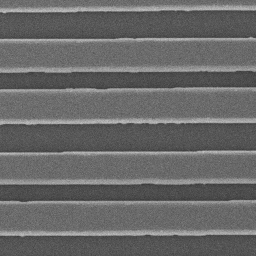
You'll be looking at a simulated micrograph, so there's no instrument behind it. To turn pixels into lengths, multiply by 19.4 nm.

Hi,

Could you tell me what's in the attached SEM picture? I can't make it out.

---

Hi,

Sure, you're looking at lines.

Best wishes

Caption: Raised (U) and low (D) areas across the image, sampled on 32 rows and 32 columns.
UUUUUUUUUUUUUUUUUUUUUUUUUUUUUUUU
DDDDDDDDDDDDDDDDDDDDDDDDDDDDDDDD
DDDDDDDDDDDDDDDDDDDDDDDDDDDDDDDD
DDDDDDDDDDDDDDDDDDDDDDDDDDDDDDDD
DDDDDDDDDDDDDDDDDDDDDDDDDDDDDDDD
UUUUUUUUUUUUUUUUUUUUUUUUUUUUUUUU
UUUUUUUUUUUUUUUUUUUUUUUUUUUUUUUU
UUUUUUUUUUUUUUUUUUUUUUUUUUUUUUUU
UUUUUUUUUUUUUUUUUUUUUUUUUUUUUUUU
DDDDDDDDDDDDDDDDDDDDDDDDDDDDDDDD
DDDDDDDDDDDDDDDDDDDDDDDDDDDDDDDD
UUUUUUUUUUUUUUUUUUUUUUUUUUUUUUUU
UUUUUUUUUUUUUUUUUUUUUUUUUUUUUUUU
UUUUUUUUUUUUUUUUUUUUUUUUUUUUUUUU
UUUUUUUUUUUUUUUUUUUUUUUUUUUUUUUU
DDDDDDDDDDDDDDDDDDDDDDDDDDDDDDDD
DDDDDDDDDDDDDDDDDDDDDDDDDDDDDDDD
DDDDDDDDDDDDDDDDDDDDDDDDDDDDDDDD
DDDDDDDDDDDDDDDDDDDDDDDDDDDDDDDD
UUUUUUUUUUUUUUUUUUUUUUUUUUUUUUUU
UUUUUUUUUUUUUUUUUUUUUUUUUUUUUUUU
UUUUUUUUUUUUUUUUUUUUUUUUUUUUUUUU
UUUUUUUUUUUUUUUUUUUUUUUUUUUUUUUU
DDDDDDDDDDDDDDDDDDDDDDDDDDDDDDDD
DDDDDDDDDDDDDDDDDDDDDDDDDDDDDDDD
UUUUUUUUUUUUUUUUUUUUUUUUUUUUUUUU
UUUUUUUUUUUUUUUUUUUUUUUUUUUUUUUU
UUUUUUUUUUUUUUUUUUUUUUUUUUUUUUUU
UUUUUUUUUUUUUUUUUUUUUUUUUUUUUUUU
DDDDDDDDDDDDDDDDDDDDDDDDDDDDDDDD
DDDDDDDDDDDDDDDDDDDDDDDDDDDDDDDD
DDDDDDDDDDDDDDDDDDDDDDDDDDDDDDDD